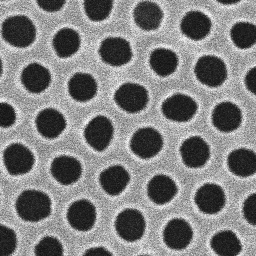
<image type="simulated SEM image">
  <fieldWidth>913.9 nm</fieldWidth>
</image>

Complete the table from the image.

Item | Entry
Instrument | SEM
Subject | a regular array of holes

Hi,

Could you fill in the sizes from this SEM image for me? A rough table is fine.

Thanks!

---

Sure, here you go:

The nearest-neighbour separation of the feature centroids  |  0.17 micrometres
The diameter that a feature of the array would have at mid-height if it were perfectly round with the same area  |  0.112 micrometres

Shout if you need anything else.